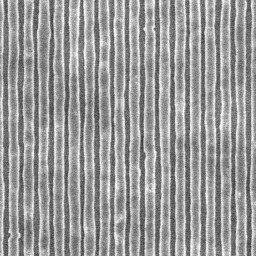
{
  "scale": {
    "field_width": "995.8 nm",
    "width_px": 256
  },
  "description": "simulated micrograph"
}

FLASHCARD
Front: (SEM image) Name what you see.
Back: parallel lines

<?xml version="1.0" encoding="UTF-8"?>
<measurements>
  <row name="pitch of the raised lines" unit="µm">0.0589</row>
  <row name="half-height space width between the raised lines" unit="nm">20.9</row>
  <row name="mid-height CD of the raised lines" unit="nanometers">37.9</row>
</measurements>